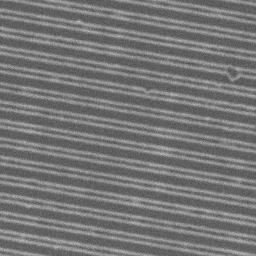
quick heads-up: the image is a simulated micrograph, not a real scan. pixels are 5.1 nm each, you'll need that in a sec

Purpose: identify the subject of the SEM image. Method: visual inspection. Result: parallel lines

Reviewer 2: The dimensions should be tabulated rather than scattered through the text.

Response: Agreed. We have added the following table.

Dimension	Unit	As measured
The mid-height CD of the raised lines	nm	33.9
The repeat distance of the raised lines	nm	92.6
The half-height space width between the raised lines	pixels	11.2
